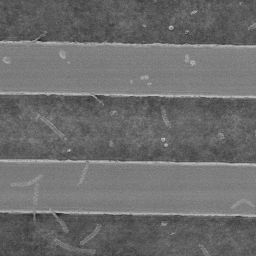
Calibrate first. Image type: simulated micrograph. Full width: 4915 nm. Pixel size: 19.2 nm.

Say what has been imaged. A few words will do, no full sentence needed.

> lines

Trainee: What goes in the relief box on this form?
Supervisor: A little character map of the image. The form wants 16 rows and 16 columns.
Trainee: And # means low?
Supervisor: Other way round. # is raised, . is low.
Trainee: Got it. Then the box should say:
................
................
................
################
################
################
................
................
................
................
################
################
################
...............#
................
................